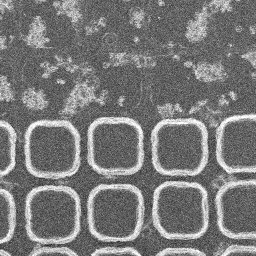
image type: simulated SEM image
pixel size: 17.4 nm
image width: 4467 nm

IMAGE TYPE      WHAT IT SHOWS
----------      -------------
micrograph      raised bodies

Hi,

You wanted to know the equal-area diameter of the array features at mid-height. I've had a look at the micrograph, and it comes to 974 nm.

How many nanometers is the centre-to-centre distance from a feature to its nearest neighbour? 1090